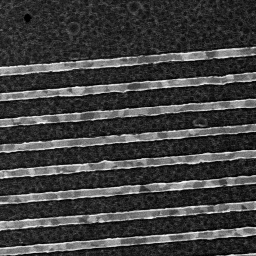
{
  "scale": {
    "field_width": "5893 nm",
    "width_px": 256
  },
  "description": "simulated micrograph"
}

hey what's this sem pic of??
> parallel lines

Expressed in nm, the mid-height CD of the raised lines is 172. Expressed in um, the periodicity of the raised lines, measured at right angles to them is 0.591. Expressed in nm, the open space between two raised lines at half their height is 427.